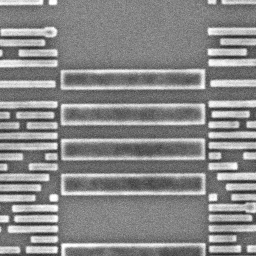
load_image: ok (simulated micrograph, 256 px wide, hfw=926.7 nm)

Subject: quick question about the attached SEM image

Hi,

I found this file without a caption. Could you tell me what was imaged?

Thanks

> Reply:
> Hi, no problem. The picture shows wiring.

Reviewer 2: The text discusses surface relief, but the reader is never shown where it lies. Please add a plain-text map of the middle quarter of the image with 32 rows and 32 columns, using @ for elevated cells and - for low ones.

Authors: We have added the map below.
--------------------------------
--------------------------------
@@@@@@@@@@@@@@@@@@@@@@@@@@@@@@@@
@@@@@@@@@@@@@@@@@@@@@@@@@@@@@@@@
@@@@@@@@@@@@@@@@@@@@@@@@@@@@@@@@
@@@@@@@@@@@@@@@@@@@@@@@@@@@@@@@@
--------------------------------
--------------------------------
--------------------------------
--------------------------------
@@@@@@@@@@@@@@@@@@@@@@@@@@@@@@@@
@@@@@@@@@@@@@@@@@@@@@@@@@@@@@@@@
@@@@@@@@@@@@@@@@@@@@@@@@@@@@@@@@
@@@@@@@@@@@@@@@@@@@@@@@@@@@@@@@@
@@@@@@@@@@@@@@@@@@@@@@@@@@@@@@@@
--------------------------------
--------------------------------
--------------------------------
--------------------------------
@@@@@@@@@@@@@@@@@@@@@@@@@@@@@@@@
@@@@@@@@@@@@@@@@@@@@@@@@@@@@@@@@
@@@@@@@@@@@@@@@@@@@@@@@@@@@@@@@@
@@@@@@@@@@@@@@@@@@@@@@@@@@@@@@@@
@@@@@@@@@@@@@@@@@@@@@@@@@@@@@@@@
--------------------------------
--------------------------------
--------------------------------
--------------------------------
@@@@@@@@@@@@@@@@@@@@@@@@@@@@@@@@
@@@@@@@@@@@@@@@@@@@@@@@@@@@@@@@@
@@@@@@@@@@@@@@@@@@@@@@@@@@@@@@@@
@@@@@@@@@@@@@@@@@@@@@@@@@@@@@@@@